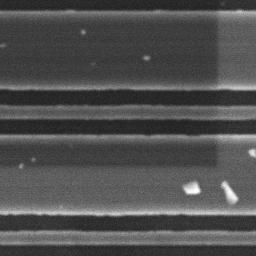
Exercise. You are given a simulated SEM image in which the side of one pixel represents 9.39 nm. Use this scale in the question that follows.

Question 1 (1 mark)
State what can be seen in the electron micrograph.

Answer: lines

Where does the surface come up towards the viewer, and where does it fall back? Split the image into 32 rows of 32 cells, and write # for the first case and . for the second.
................................
################################
################################
################################
################################
################################
################################
################################
################################
################################
################################
................................
................................
################################
################################
................................
................................
################################
################################
################################
################################
################################
################################
################################
################################
################################
################################
................................
................................
################################
...##....#####....####.....#####
................................